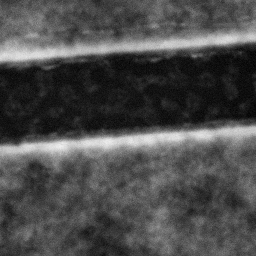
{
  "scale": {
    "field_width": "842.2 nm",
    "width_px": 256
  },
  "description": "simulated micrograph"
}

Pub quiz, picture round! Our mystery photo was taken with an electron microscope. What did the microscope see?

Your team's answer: one or a few lines or trenches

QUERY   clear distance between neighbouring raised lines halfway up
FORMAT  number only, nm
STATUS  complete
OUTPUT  302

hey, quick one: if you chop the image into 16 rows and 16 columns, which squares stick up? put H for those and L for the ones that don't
HHHHHHHHHHHHHHHH
HHHHHHHHHHHHHHHH
HHHHHHHHHHHHHHLL
HHLLLLLLLLLLLLLL
LLLLLLLLLLLLLLLL
LLLLLLLLLLLLLLLL
LLLLLLLLLLLLLLLL
LLLLLLLLLLLLLLLL
LLLLLLLLLLLHHHHH
HHHHHHHHHHHHHHHH
HHHHHHHHHHHHHHHH
HHHHHHHHHHHHHHHH
HHHHHHHHHHHHHHHH
HHHHHHHHHHHHHHHH
HHHHHHHHHHHHHHHH
HHHHHHHHHHHHHHHH